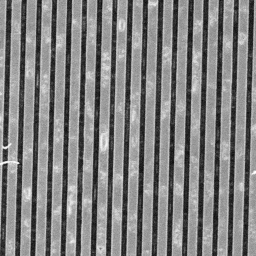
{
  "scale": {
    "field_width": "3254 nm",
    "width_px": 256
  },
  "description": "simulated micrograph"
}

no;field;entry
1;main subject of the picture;parallel lines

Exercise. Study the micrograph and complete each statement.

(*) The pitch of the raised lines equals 192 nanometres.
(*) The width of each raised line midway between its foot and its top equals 119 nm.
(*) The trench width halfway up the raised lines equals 5.5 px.